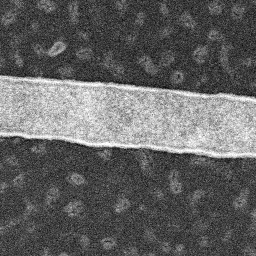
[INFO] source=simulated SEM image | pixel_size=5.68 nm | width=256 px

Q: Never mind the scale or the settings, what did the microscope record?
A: one or a few lines or trenches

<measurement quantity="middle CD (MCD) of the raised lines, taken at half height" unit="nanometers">319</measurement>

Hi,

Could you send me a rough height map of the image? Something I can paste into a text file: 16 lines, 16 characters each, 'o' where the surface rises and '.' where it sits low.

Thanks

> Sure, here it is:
................
................
................
................
................
oooooooo........
oooooooooooooooo
oooooooooooooooo
..oooooooooooooo
.............ooo
................
................
................
................
................
................